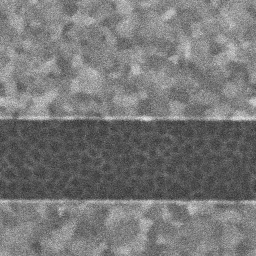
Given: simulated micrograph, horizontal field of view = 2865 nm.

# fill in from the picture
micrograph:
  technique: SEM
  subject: one or a few lines or trenches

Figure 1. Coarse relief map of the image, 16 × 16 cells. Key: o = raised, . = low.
oooooooooooooooo
oooooooooooooooo
oooooooooooooooo
oooooooooooooooo
oooooooooooooooo
oooooooooooooooo
oooooooooooooooo
................
................
................
................
................
................
oooooooooooooooo
oooooooooooooooo
oooooooooooooooo